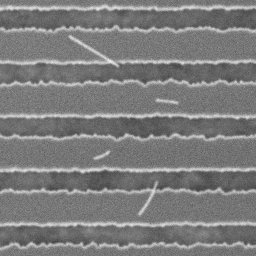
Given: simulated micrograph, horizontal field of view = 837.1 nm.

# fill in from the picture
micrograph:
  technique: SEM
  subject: lines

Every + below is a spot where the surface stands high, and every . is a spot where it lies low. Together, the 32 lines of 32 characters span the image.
++++++++++++++++++++++++++++++++
................................
................................
........++....+.....+..++++.....
++++++++++++++++++++++++++++++++
++++++++++++++++++++++++++++++++
++++++++++++++++++++++++++++++++
++++++++++++++++++++++++++++++++
................................
................................
.+++++++.+++++++++++++++.+++++++
++++++++++++++++++++++++++++++++
++++++++++++++++++++++++++++++++
++++++++++++++++++++++++++++++++
+.++++.++++++++++++..+.+++++++++
................................
................................
++++++++++++++++++++++++++++++++
++++++++++++++++++++++++++++++++
++++++++++++++++++++++++++++++++
++++++++++++++++++++++++++++++++
................................
................................
................................
++++++++++++++++++++++++++++++++
++++++++++++++++++++++++++++++++
++++++++++++++++++++++++++++++++
++++++++++++++++++++++++++++++++
................................
................................
.+.....++..+.......+++..++...+..
++++++++++++++++++++++++++++++++